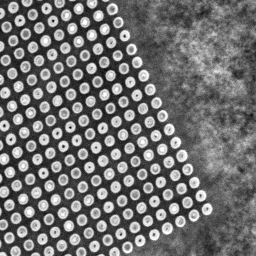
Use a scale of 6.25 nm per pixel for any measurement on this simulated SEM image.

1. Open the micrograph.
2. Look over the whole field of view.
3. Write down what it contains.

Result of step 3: a regular array of raised bodies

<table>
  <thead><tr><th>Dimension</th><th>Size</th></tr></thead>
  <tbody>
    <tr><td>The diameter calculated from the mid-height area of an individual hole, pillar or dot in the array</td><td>61.1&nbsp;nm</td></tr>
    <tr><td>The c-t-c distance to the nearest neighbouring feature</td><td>89.6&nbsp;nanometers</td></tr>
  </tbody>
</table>